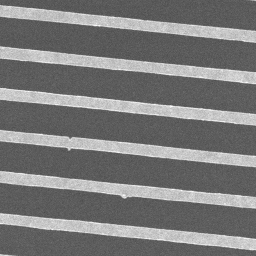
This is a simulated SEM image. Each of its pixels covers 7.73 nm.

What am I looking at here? parallel lines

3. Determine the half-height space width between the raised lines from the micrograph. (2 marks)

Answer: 30.6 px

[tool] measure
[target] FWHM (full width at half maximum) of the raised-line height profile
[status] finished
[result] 82.6 nanometres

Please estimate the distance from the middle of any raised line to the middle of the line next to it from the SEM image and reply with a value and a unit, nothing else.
319 nm